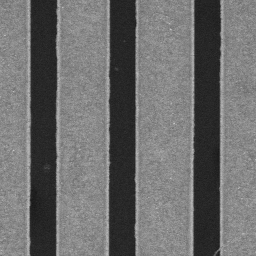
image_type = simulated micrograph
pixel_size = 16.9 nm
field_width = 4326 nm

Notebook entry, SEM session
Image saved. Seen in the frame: lines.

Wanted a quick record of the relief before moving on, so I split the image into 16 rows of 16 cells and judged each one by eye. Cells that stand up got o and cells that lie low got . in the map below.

oo..ooo..ooo..oo
oo..ooo..ooo..oo
oo..ooo..ooo..oo
oo..ooo..ooo..oo
oo..ooo..ooo..oo
oo..ooo..ooo..oo
oo..ooo..ooo..oo
oo..ooo..ooo..oo
oo..ooo..ooo..oo
oo..ooo..ooo..oo
oo..ooo..ooo..oo
oo..ooo..ooo..oo
oo..ooo..ooo..oo
oo..ooo..ooo..oo
oo..ooo..ooo..oo
oo..ooo..ooo..oo